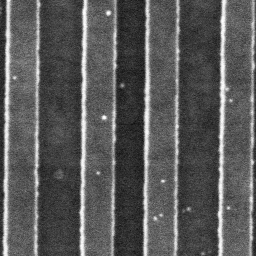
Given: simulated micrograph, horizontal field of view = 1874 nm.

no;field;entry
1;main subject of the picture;lines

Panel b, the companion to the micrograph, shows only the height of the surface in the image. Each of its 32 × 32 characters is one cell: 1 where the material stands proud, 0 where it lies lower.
01111000000111000011110000001111
01111000001111000011110000001111
01111000001111000011110000001111
01111000001111000011110000001111
01111000001111000011110000001111
01111000001111000011110000001111
01111000001111000011110000001111
01111000001111000011110000001111
01111000001111000011110000001111
01111000001111000011110000001111
01111000001111000011110000001111
01111000001111000011110000001111
01111000001111000011110000001111
01111000001111000011110000001111
01111000001111000011110000001111
01111000001111000011110000001111
01111000001111000011110000001111
01111000001111000011110000001111
01111000001111000011110000001111
01111000001111000011110000001110
01111000001111000011110000001111
01111000001111000011110000011110
01111000001111000011110000011110
01111000001111000011110000011110
01111000001111000011110000011110
01111000001111000011110000011110
01111000001111000011110000011110
01111000001111000011110000011110
01111000001111000011110000011110
01111000001111000011110000011110
01111000001111000011110000011110
01111000001111000011110000011110